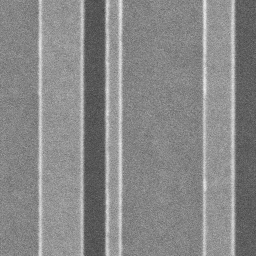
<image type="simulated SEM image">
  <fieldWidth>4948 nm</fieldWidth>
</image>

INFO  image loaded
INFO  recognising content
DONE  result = lines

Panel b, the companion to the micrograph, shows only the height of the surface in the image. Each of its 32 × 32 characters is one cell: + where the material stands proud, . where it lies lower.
.....+++++...++...........+++...
.....+++++...++...........+++...
.....+++++...++...........+++...
.....+++++...++...........+++...
.....+++++...++...........+++...
.....+++++...++...........+++...
.....+++++...++...........+++...
.....+++++...++...........+++...
.....+++++...++...........+++...
.....+++++...++...........+++...
.....+++++...++...........+++...
.....+++++...++...........+++...
.....+++++...++...........+++...
.....+++++...++...........+++...
.....+++++...++...........+++...
.....+++++...++...........+++...
.....+++++...++...........+++...
.....+++++...++...........+++...
.....+++++...++...........+++...
.....+++++...++...........+++...
.....+++++...++...........+++...
.....+++++...++...........+++...
.....+++++...++...........+++...
.....+++++...++...........+++...
.....+++++...++...........+++...
.....+++++...++...........+++...
.....+++++...++...........+++...
.....+++++...++...........+++...
.....+++++...++...........+++...
.....+++++...++...........+++...
.....+++++...++...........+++...
.....+++++...++...........+++...